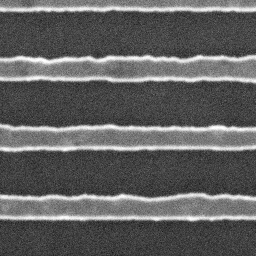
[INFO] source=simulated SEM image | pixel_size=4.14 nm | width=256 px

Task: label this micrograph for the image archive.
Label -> lines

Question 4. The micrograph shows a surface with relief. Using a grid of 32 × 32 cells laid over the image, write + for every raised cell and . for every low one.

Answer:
++++++++++++++++++++++++++++++++
................................
................................
................................
................................
................................
................................
++++++.+++++++++++++++++++++++++
++++++++++++++++++++++++++++++++
++++++++++++++++++++++++++++++++
................................
................................
................................
................................
................................
................................
++++++++++++++++++++++++++++++++
++++++++++++++++++++++++++++++++
++++++++++++++++++++++++++++++++
................................
................................
................................
................................
................................
..........+....+......++++.++...
++++++++++++++++++++++++++++++++
++++++++++++++++++++++++++++++++
................................
................................
................................
................................
................................